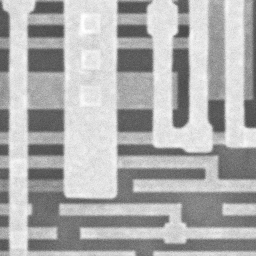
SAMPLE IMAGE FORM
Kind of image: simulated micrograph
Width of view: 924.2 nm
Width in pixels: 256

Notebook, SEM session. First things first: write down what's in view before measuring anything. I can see wiring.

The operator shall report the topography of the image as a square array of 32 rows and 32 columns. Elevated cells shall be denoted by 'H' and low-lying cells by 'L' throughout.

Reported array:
HHHHLLLLHHHHHHHLLLLHHHLLHHLLHHLL
LHHHLLLLHHHHHHHLLLLHHHLLHHLLHHLL
LHHLLLLLHHHHHHHLLLLHHHLLHHLLHHLL
LHHLLLLLHHHHHHLLLLLHHHLLHHLLHHLL
LHHLLLLLHHHHHHLLLLLHHHLLHHLLHHLL
LHHLLLLLHHHHHHLLLLLHHLLLHHLLHHLL
LHHLLLLLHHHHHHLLLLLHHLLLHHLLHHLL
LHHLLLLLHHHHHHLLLLLHHLLLHHLLHHLL
LHHLLLLLHHHHHHLLLLLHHLLLHHLLHHLL
LHHLLLLLHHHHHHLLLLLHHLLLHHLLHHLL
LHHLLLLLHHHHHHLLLLLHHLLLHHLLHHLL
LHHLLLLLHHHHHHLLLLLHHLLLHHLLHHLL
LHHLLLLLHHHHHHLLLLLHHLLLHHLLHHLL
LHHLLLLLHHHHHHLLLLLHHLLLHHLLHHLL
LHHLLLLLHHHHHHLLLLLHHLLLHHLLHHLL
LHHLLLLLHHHHHHHLLLLHHHLHHHLLHHLL
LHHLLLLLHHHHHHHLLLLHHHHHHHLLHHHH
LHHLLLLLHHHHHHLLLLLHHHHHHHLLHHHH
LHHLLLLLHHHHHHLLLLLLLLLHHHLLLLLL
LHHLLLLLHHHHHHHLLLLLLLLLLLLLLLLL
LHHLLLLLHHHHHHHLLLLLLLLLLLLLLLLL
LHHLLLLLHHHHHHLLLLLLLLLLLLLLLLLL
LHHLLLLLHHHHHHLLLLLLLLLLLLLLLLLL
LHHLLLLLHHHHHHLLLLLLLLLLLLLLLLLL
LHHLLLLLHHHHHHLLLLLLLLLLLLLLLLLL
LHHLLLLLLLLLLLLLLLLLLLLLLLLLLLLL
LHHLLLLLLLLLLLLLLLLLLLLLLLLLLLLL
LHHLLLLLLLLLLLLLLLLLLLLLLLLLLLLL
LHHLLLLLLLLLLLLLLLLLLLLLLLLLLLLL
LHHLLLLLLLLLLLLLLLLLLLLLLLLLLLLL
LHHLLLLLLLLLLLLLLLLLLLLLLLLLLLLL
LHHLLLLLLLLLLLLLLLLLLLLLLLLLLLLL